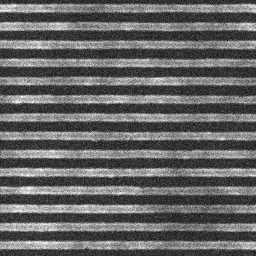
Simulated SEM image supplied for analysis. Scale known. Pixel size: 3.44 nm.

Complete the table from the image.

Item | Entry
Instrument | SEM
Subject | parallel lines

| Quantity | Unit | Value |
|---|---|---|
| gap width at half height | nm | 40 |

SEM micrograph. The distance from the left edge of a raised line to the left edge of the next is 62.6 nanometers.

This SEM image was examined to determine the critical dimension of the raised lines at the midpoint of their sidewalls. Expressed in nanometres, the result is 23.2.